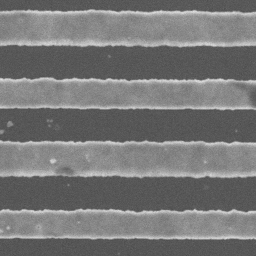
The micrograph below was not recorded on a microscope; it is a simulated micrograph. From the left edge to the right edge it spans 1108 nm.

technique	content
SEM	lines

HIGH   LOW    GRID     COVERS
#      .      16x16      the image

................
################
################
................
................
################
################
................
................
################
################
................
................
################
################
................